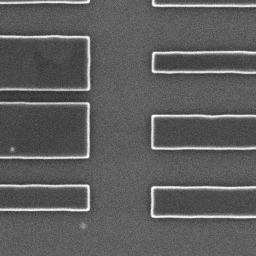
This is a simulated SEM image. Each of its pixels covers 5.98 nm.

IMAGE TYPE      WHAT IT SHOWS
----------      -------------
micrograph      groups of lines, slits or small figures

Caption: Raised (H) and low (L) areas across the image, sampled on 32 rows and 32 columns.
LLLLLLLLLLLLLLLLLLLHHHHHHHHHHHHH
LLLLLLLLLLLLLLLLLLLLLLLLLLLLLLLL
LLLLLLLLLLLLLLLLLLLLLLLLLLLLLLLL
LLLLLLLLLLLLLLLLLLLLLLLLLLLLLLLL
LLLLLLLLLLLLLLLLLLLLLLLLLLLLLLLL
HHHHHHHHHHHLLLLLLLLLLLLLLLLLLLLL
HHHHHHHHHHHLLLLLLLLLLLLLLLLLLLLL
HHHHHHHHHHHLLLLLLLLHHHHHHHHHHHHH
HHHHHHHHHHHLLLLLLLLHHHHHHHHHHHHH
HHHHHHHHHHHLLLLLLLLLLLLLLLLLLLLL
HHHHHHHHHHHLLLLLLLLLLLLLLLLLLLLL
LLLLLLLLLLLLLLLLLLLLLLLLLLLLLLLL
LLLLLLLLLLLLLLLLLLLLLLLLLLLLLLLL
HHHHHHHHHHHLLLLLLLLLLLLLLLLLLLLL
HHHHHHHHHHHLLLLLLLLHHHHHHHLHHHHH
HHHHHHHHHHHLLLLLLLLHHHHHHHHHHHHH
HHHHHHHHHHHLLLLLLLLHHHHHHHHHHHHH
HHHHHHHHHHHLLLLLLLLHHHHHHHHHHHHH
HHHHHHHHHHHLLLLLLLLHHHHHHHHHHHHH
HHHHHHHHHHHLLLLLLLLLLLLLLLLLLLLL
LLLLLLLLLLLLLLLLLLLLLLLLLLLLLLLL
LLLLLLLLLLLLLLLLLLLLLLLLLLLLLLLL
LLLLLLLLLLLLLLLLLLLLLLLLLLLLLLLL
HHHHHHHHHHHLLLLLLLLHHHHHHHHHHHHH
HHHHHHHHHHHLLLLLLLLHHHHHHHHHHHHH
HHHHHHHHHHHLLLLLLLLHHHHHHHHHHHHH
LLLLLLLLLLLLLLLLLLLHHHHHHHHHHHHH
LLLLLLLLLLLLLLLLLLLLLLLLLLLLLLLL
LLLLLLLLLLLLLLLLLLLLLLLLLLLLLLLL
LLLLLLLLLLLLLLLLLLLLLLLLLLLLLLLL
LLLLLLLLLLLLLLLLLLLLLLLLLLLLLLLL
LLLLLLLLLLLLLLLLLLLLLLLLLLLLLLLL